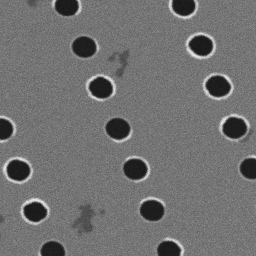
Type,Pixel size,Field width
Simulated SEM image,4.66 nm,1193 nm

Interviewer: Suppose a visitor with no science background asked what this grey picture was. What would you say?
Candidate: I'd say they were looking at a regular array of holes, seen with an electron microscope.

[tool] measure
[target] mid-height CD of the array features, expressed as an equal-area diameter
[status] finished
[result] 106 nanometres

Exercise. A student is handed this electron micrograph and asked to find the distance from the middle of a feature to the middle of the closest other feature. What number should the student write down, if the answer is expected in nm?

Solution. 206